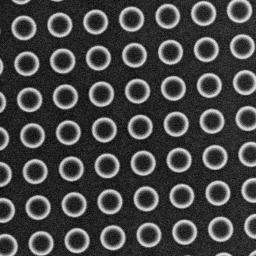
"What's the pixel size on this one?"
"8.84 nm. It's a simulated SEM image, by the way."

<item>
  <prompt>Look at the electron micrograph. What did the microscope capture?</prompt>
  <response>an array of small figures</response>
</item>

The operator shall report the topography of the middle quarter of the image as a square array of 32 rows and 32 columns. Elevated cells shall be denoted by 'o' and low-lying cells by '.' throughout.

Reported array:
oo....ooooo.....ooo.............
oo..............................
................................
..........................ooo...
.................ooo.....ooooo..
o......ooooo....ooooo....ooooo..
ooo....ooooo....ooooo...oooooo..
ooo....ooooo....ooooo....ooooo..
ooo....ooooo....ooooo.....ooo...
ooo....ooooo.....ooo............
oo..............................
................................
...........................ooo..
..........o......oooo....ooooo..
oo......oooo....oooooo...oooooo.
oooo...oooooo...oooooo...oooooo.
oooo...oooooo...oooooo...oooooo.
oooo...oooooo....oooo.....oooo..
oooo....oooo......oo............
ooo.............................
................................
...........................ooo..
..........o.......oooo....ooooo.
.oo......oooo....ooooo....oooooo
oooo....oooooo...oooooo...oooooo
ooooo...oooooo...oooooo...ooooo.
ooooo...oooooo...ooooo.....ooo..
ooooo....oooo......oo...........
oooo............................
................................
............................ooo.
...........o.......ooo.....ooooo